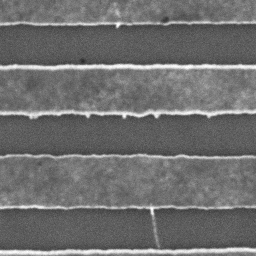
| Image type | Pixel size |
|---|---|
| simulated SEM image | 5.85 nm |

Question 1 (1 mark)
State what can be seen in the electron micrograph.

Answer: lines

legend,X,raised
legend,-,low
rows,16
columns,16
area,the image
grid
XXXXXXXXXXXXXXXX
X-XXXX-X--------
----------------
----------------
XXXXXXXXXXXXXXXX
XXXXXXXXXXXXXXXX
XXXXXXXXXXXXXXXX
----------------
----------------
----------------
XXXXXXXXXXXXXXXX
XXXXXXXXXXXXXXXX
XXXXXXXXXXXXXXXX
----------------
----------------
----------------